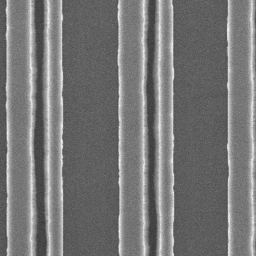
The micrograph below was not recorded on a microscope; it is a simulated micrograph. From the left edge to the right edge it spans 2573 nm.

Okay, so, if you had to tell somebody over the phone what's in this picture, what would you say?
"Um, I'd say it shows lines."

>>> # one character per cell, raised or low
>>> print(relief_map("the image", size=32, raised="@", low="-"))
-@@@--@@-------@@@--@@-------@@@
-@@@--@@-------@@@--@@-------@@@
-@@@--@@-------@@@--@@-------@@@
-@@@--@@-------@@@--@@------@@@@
-@@@--@@-------@@@--@@-------@@@
-@@@--@@-------@@@--@@-------@@@
-@@@--@@-------@@@--@@-------@@@
-@@@--@@-------@@@--@@-------@@@
-@@@--@@-------@@@--@@-------@@@
-@@@--@@-------@@@--@@-------@@@
-@@@--@@-------@@@--@@-------@@@
-@@@--@@-------@@@--@@-------@@@
-@@@--@@-------@@@--@@-------@@@
-@@@--@@-------@@@--@@-------@@@
-@@@--@@-------@@@--@@-------@@@
-@@@--@@-------@@@--@@-------@@@
-@@@--@@-------@@@--@@-------@@@
-@@@--@@-------@@@--@@-------@@@
-@@@--@@-------@@@--@@-------@@@
-@@@--@@-------@@@--@@-------@@@
-@@@--@@-------@@@--@@-------@@@
-@@@--@@-------@@@--@@-------@@@
-@@@--@@-------@@@--@@-------@@@
-@@@--@@-------@@@--@@-------@@@
-@@@--@@-------@@@--@@-------@@@
-@@@--@@-------@@@--@@-------@@@
-@@@--@@-------@@@--@@-------@@@
-@@@--@@-------@@@--@@-------@@@
-@@@--@@-------@@@--@@-------@@@
-@@@--@@-------@@@--@@-------@@@
-@@@--@@-------@@@--@@-------@@@
-@@@--@@-------@@@--@@-------@@@